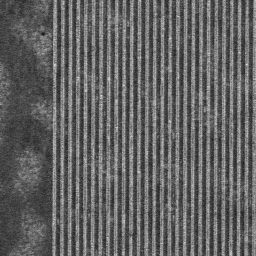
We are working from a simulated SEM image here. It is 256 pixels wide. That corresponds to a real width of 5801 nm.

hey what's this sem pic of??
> parallel lines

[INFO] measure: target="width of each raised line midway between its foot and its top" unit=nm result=36.8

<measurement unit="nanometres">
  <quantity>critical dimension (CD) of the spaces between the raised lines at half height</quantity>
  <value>136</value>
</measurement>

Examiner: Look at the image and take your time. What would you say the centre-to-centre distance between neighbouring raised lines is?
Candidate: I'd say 174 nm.